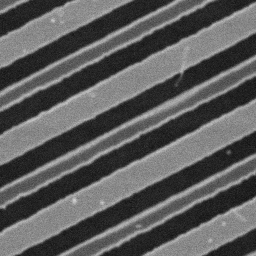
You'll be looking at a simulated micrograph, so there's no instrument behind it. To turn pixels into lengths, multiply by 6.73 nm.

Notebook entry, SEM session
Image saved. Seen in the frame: lines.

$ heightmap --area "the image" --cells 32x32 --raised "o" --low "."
oo......ooooooo......ooooo......
......oooooooo.....ooooo......oo
....oooooooo.....ooooo......oooo
...ooooooo.....ooooo......oooooo
oooooooo.....ooooo......ooooooo.
oooooo.....ooooo......ooooooo...
oooo.....ooooo......ooooooo.....
oo......oooo......ooooooo......o
......oooo......ooooooo......ooo
....ooooo.....oooooooo.....ooooo
..ooooo.....oooooooo.....ooooo..
oooo......oooooooo.....ooooo....
ooo.....oooooooo......oooo......
o......ooooooo......oooo......oo
.....ooooooo......oooo......oooo
...ooooooo......oooo......oooooo
.ooooooo......oooo......oooooooo
oooooo......ooooo.....oooooooo..
oooo......oooo......oooooooo....
oo......ooooo.....oooooooo.....o
......ooooo.....oooooooo.....ooo
....ooooo.....oooooooo......oooo
..ooooo......ooooooo......oooo..
ooooo......ooooooo......oooo....
ooo......ooooooo......ooooo.....
o......ooooooo......oooo......oo
.....ooooooo......ooooo.....oooo
...ooooooo......ooooo.....oooooo
.ooooooo......ooooo......ooooooo
ooooooo.....ooooo.....oooooooo..
ooooo.....ooooo......ooooooo....
ooo.....ooooo......ooooooo......